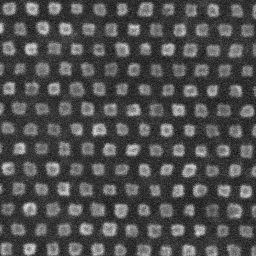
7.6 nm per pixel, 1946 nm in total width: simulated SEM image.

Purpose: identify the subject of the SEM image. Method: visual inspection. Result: a regular array of raised bodies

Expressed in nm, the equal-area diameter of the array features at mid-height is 86.2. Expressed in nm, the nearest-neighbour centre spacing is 169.